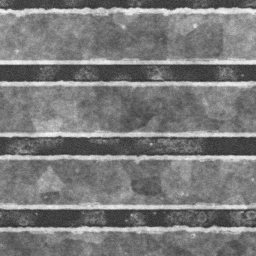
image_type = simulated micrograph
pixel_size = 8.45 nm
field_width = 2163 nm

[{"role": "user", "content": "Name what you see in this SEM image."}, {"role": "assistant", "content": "one or a few lines or trenches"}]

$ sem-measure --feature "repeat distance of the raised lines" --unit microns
0.615